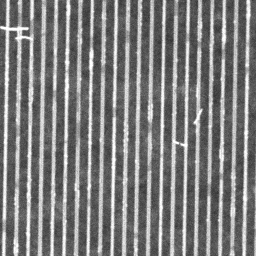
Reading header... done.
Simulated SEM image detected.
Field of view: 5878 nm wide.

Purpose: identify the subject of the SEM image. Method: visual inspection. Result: parallel lines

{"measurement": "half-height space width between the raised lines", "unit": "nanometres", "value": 218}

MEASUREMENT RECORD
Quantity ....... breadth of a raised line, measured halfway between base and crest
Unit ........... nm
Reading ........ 63.1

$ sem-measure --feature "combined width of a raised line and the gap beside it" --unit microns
0.276